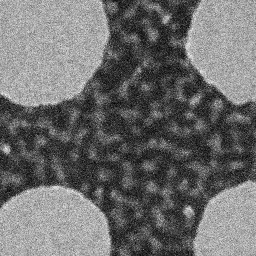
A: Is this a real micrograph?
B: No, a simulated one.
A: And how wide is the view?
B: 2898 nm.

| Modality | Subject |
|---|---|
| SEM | raised bodies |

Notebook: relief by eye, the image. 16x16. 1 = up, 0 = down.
1111110000001111
1111111000001111
1111111000001111
1111110000001111
1111110000001111
1111100000000011
0110000000000000
0000000000000000
0000000000000000
0000000000000000
0000000000000000
0000000000000001
0111100000000111
1111110000000111
1111111000001111
1111111000001111